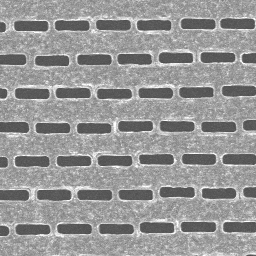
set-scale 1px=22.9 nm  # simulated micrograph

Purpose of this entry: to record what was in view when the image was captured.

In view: a regular array of holes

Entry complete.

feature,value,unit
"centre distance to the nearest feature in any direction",38.9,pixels